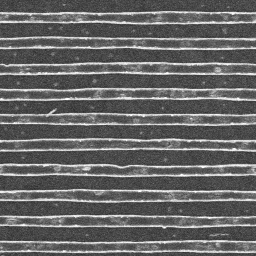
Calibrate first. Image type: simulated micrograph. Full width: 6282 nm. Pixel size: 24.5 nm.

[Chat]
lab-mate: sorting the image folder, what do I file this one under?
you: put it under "parallel lines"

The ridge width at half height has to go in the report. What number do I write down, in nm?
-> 258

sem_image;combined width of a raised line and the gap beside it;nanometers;624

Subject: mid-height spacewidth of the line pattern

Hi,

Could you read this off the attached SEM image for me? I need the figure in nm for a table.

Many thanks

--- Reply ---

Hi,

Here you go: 374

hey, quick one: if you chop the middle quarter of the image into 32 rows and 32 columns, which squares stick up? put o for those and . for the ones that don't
oooooooooooooooooooooooooooooooo
oooooooooooooooooooooooooooooooo
................................
................................
................................
................................
..oooooooooooooooooooooooooooooo
oooooooooooooooooooooooooooooooo
oooooooooooooooooooooooooooooooo
................................
................................
................................
oooooooooooooo..................
oooooooooooooooooooooooooooooooo
oooooooooooooooooooooooooooooooo
................................
................................
................................
................................
oooooooooooooooooooooooooooooooo
oooooooooooooooooooooooooooooooo
ooo.............................
................................
................................
................................
ooooooooooooo...ooo.............
oooooooooooooooooooooooooooooooo
oooooooooooooooooooooooooooooooo
................................
................................
................................
..ooo...........................